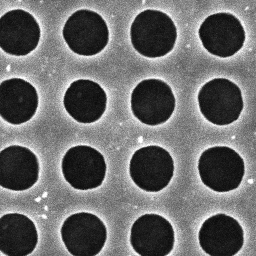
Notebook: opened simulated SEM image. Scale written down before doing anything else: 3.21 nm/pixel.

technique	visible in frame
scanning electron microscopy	a regular array of holes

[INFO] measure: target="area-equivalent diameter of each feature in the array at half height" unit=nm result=147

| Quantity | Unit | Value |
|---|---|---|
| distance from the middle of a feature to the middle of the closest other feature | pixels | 66.8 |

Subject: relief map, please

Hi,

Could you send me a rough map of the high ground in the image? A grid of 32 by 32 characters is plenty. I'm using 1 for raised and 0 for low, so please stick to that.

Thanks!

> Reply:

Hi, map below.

11111111111111111111111111111111
10011111100011111100111111111111
00001111000001111000011111000011
00000111000001110000001110000011
00000111000000110000001110000001
00000111000001110000001110000011
10001111100011111000011111000011
11111111111111111111111111111111
11111111111111111111111111111111
11111111111111111111111111111111
00001111100011111000011111000111
00000111000001111000001110000011
00000111000001110000001110000011
00000111000001110000001110000011
00001111100001111000011111000011
10011111111111111100111111100111
11111111111111111111111111111111
11111111111111111111111111111111
10011111100011111100111111000111
00001111000001111000011110000011
00000111000001110000001110000011
00000111000001110000001110000001
00000111000001111000011110000011
10001111100011111000111111000111
11111111111111111111111111111111
11111111111111111111111111111111
11111111111111111111111111111111
00001111000001111000011111000111
00001111000001110000001110000011
00000111000001110000001110000011
00000111000001110000001110000011
00001111100011111000011111000011